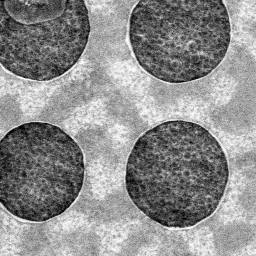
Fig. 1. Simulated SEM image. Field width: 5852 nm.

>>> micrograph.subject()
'holes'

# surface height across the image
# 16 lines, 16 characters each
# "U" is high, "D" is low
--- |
DDDDDUUUDDDDDDUU
DDDDDDUUDDDDDDUU
DDDDDDUUDDDDDDUU
DDDDDUUUDDDDDDUU
UDDDUUUUUDDDDUUU
UUUUUUUUUUUUUUUU
UUUUUUUUUUUUUUUU
UUUUUUUUUUUUUUUU
DDDDUUUUUDDDDUUU
DDDDDUUUDDDDDDUU
DDDDDUUUDDDDDDUU
DDDDDUUUDDDDDDUU
DDDDDUUUDDDDDDUU
UDDDUUUUUDDDDUUU
UUUUUUUUUUUUUUUU
UUUUUUUUUUUUUUUU